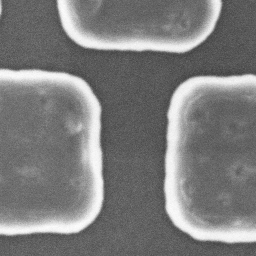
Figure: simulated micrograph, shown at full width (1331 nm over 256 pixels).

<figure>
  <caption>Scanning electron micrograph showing raised bodies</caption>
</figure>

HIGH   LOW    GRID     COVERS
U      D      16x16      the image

DDDDUUUUUUUUUUDD
DDDDUUUUUUUUUDDD
DDDDDUUUUUUUUDDD
DDDDDDDDDDDDDDDD
DDDDDDDDDDDDDDDD
UUUUUDDDDDDDUUUU
UUUUUUDDDDDUUUUU
UUUUUUDDDDDUUUUU
UUUUUUDDDDDUUUUU
UUUUUUDDDDDUUUUU
UUUUUUDDDDDUUUUU
UUUUUUDDDDDUUUUU
UUUUUUDDDDDUUUUU
UUUUUUDDDDDUUUUU
UUDDDDDDDDDDUUUU
DDDDDDDDDDDDDDDD